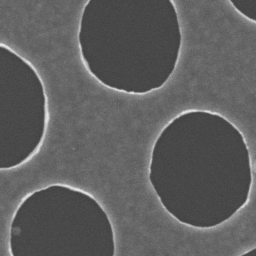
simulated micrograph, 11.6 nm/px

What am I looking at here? holes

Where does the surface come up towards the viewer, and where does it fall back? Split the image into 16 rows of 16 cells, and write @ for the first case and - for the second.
@@@@@------@@@@-
@@@@@------@@@@@
@@@@@------@@@@@
-@@@@------@@@@@
--@@@@-----@@@@@
---@@@@---@@@@@@
---@@@@@@@@@@@@@
---@@@@@@@@---@@
---@@@@@@@-----@
--@@@@@@@@-----@
@@@@@@@@@-------
@@@@@@@@@@------
@@----@@@@-----@
@------@@@@---@@
@------@@@@@@@@@
@------@@@@@@@@@